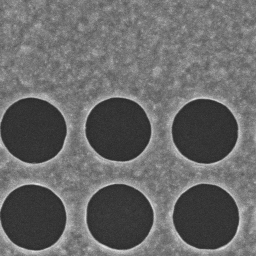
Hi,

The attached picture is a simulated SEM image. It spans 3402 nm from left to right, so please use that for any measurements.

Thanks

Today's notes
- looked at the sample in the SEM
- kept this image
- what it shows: holes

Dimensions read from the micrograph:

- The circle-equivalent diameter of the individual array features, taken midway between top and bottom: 882 nm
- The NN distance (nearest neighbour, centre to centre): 1150 nm